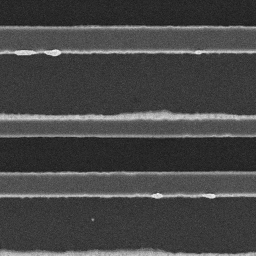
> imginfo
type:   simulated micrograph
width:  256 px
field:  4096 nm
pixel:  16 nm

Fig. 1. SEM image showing lines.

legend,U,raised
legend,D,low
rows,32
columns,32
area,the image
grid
DDDDDDDDDDDDDDDDDDDDDDDDDDDDDDDD
DDDDDDDDDDDDDDDDDDDDDDDDDDDDDDDD
DDDDDDDDDDDDDDDDDDDDDDDDDDDDDDDD
UUUUUUDDDUUUUUUUUUUUUUUUUUUUUUUU
UUUUUUUUUUUUUUUUUUUUUUUUUUUUUUUU
UUUUUUUUUUUUUUUUUUUUUUUUUUUUUUUU
DUUUUUUUDDDDDDDDDDDDDDDDUUDDDDDD
DDDDDDDDDDDDDDDDDDDDDDDDDDDDDDDD
DDDDDDDDDDDDDDDDDDDDDDDDDDDDDDDD
DDDDDDDDDDDDDDDDDDDDDDDDDDDDDDDD
DDDDDDDDDDDDDDDDDDDDDDDDDDDDDDDD
DDDDDDDDDDDDDDDDDDDDDDDDDDDDDDDD
DDDDDDDDDDDDDDDDDDDDDDDDDDDDDDDD
DDDDDDDDDDDDDDDDDDDDDDDDDDDDDDDD
DDDDDDDDDDDDDDDDDDDDDDDDDDDDDDDD
UUUUUUUUUUUUUUUUUUUUUUUUUUUUUUUU
UUUUUUUUUUUUUUUUUUUUUUUUUUUUUUUU
DDDDDDDDDDDDDDDDDDDDDDDDDDDDDDDD
DDDDDDDDDDDDDDDDDDDDDDDDDDDDDDDD
DDDDDDDDDDDDDDDDDDDDDDDDDDDDDDDD
DDDDDDDDDDDDDDDDDDDDDDDDDDDDDDDD
DDDDDDDDDDDDDDDDDDDDDDDDDDDDDDDD
UUUUUUUUUUUUUUUUUUUUUUUUUUUUUUUU
UUUUUUUUUUUUUUUUUUUUUUUUUUUUUUUU
DDUUDDDDUDDDUUDDDDUUUDDDUUUDDDDD
DDDDDDDDDDDDDDDDDDDDDDDDDDDDDDDD
DDDDDDDDDDDDDDDDDDDDDDDDDDDDDDDD
DDDDDDDDDDDDDDDDDDDDDDDDDDDDDDDD
DDDDDDDDDDDDDDDDDDDDDDDDDDDDDDDD
DDDDDDDDDDDDDDDDDDDDDDDDDDDDDDDD
DDDDDDDDDDDDDDDDDDDDDDDDDDDDDDDD
DDDDDDDDDDDDDDDDDDDDDDDDDDDDDDDD